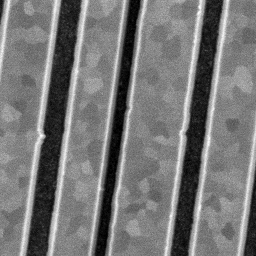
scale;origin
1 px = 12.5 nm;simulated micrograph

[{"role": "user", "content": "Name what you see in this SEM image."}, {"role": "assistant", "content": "one or a few lines or trenches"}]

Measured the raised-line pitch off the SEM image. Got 0.866 microns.